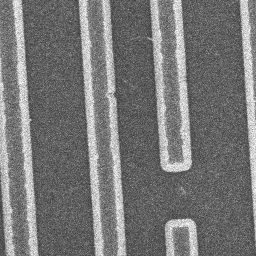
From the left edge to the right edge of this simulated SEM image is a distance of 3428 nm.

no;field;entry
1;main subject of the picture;one or a few lines or trenches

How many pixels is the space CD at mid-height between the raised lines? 62.4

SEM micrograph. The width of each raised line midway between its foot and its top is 339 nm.